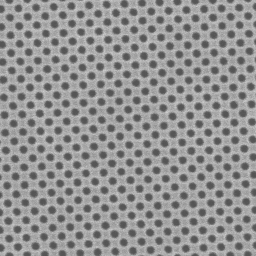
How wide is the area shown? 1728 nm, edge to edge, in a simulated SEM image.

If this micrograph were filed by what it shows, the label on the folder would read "a regular array of holes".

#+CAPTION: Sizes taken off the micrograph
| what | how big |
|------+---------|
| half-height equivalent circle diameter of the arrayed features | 0.0575 micrometres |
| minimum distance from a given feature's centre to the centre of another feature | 0.0827 microns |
